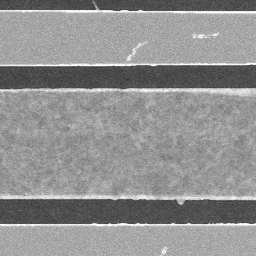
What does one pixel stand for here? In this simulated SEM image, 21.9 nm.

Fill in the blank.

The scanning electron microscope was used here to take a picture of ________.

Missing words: lines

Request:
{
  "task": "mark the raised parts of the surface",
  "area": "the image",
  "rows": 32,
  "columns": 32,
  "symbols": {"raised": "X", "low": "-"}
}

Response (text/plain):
--------------------------------
XXXXXXXXXXXXXXXXXXXXXXXXXXXXXXXX
XXXXXXXXXXXXXXXXXXXXXXXXXXXXXXXX
XXXXXXXXXXXXXXXXXXXXXXXXXXXXXXXX
XXXXXXXXXXXXXXXXXXXXXXXXXXXXXXXX
XXXXXXXXXXXXXXXXXXXXXXXXXXXXXXXX
XXXXXXXXXXXXXXXXXXXXXXXXXXXXXXXX
XXXXXXXXXXXXXXXXXXXXXXXXXXXXXXXX
--------------------------------
--------------------------------
--------------------------------
XXXXXXXXXXXXXXXXXXXXXXXXXXXXXXXX
XXXXXXXXXXXXXXXXXXXXXXXXXXXXXXXX
XXXXXXXXXXXXXXXXXXXXXXXXXXXXXXXX
XXXXXXXXXXXXXXXXXXXXXXXXXXXXXXXX
XXXXXXXXXXXXXXXXXXXXXXXXXXXXXXXX
XXXXXXXXXXXXXXXXXXXXXXXXXXXXXXXX
XXXXXXXXXXXXXXXXXXXXXXXXXXXXXXXX
XXXXXXXXXXXXXXXXXXXXXXXXXXXXXXXX
XXXXXXXXXXXXXXXXXXXXXXXXXXXXXXXX
XXXXXXXXXXXXXXXXXXXXXXXXXXXXXXXX
XXXXXXXXXXXXXXXXXXXXXXXXXXXXXXXX
XXXXXXXXXXXXXXXXXXXXXXXXXXXXXXXX
XXXXXXXXXXXXXXXXXXXXXXXXXXXXXXXX
XXXXXXXXXXXXXXXXXXXXXXXXXXXXXXXX
--------------------------------
--------------------------------
--------------------------------
XXXXXXXXXXXXXXXXXXXXXXXXXXXXXXXX
XXXXXXXXXXXXXXXXXXXXXXXXXXXXXXXX
XXXXXXXXXXXXXXXXXXXXXXXXXXXXXXXX
XXXXXXXXXXXXXXXXXXXXXXXXXXXXXXXX